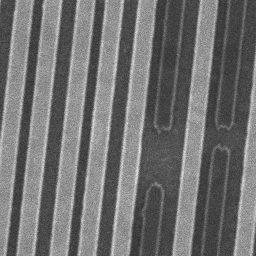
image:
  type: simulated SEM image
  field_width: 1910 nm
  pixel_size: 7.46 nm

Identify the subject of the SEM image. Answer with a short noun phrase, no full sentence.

parallel lines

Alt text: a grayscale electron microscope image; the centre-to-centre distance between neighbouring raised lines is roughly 0.227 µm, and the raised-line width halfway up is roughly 123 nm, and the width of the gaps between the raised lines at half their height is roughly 95.6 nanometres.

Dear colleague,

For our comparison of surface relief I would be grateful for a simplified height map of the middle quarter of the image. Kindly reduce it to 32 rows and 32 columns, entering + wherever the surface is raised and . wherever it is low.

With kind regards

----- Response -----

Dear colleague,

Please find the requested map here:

..++++...++++....++++...++++....
..++++...++++....++++...++++....
..+++....++++....++++...++++....
.++++....++++....++++...++++....
.++++....++++....++++...++++....
.++++...++++.....++++...++++....
.++++...++++.....+++....++++....
.++++...++++.....+++....+++.....
.++++...++++....++++....+++.....
.++++...++++....++++...++++.....
.++++...++++....++++...++++....+
.++++...++++....++++...++++....+
.++++...++++....++++...++++....+
++++....+++.....++++...++++....+
++++...++++.....++++...++++....+
++++...++++.....+++....++++....+
++++...++++.....+++............+
++++...++++....++++............+
++++...++++....++++............+
++++...++++....++++...........++
++++...++++....++++...........++
+++....++++....++++...........++
+++....+++.....++++...........++
+++...++++.....++++...........++
+++...++++.....+++............++
+++...++++.....+++............++
+++...++++....++++............++
+++...++++....++++............++
+++...++++....++++...........+++
+++...++++....++++...........+++
+++...+++.....++++....++.....+++
++....++++....++++...++++....+++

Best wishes